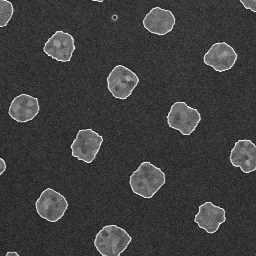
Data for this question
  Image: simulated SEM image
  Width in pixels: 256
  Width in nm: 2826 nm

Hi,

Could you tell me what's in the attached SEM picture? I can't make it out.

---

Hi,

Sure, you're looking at a regular array of raised bodies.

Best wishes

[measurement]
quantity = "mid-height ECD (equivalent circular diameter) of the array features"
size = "330 nanometres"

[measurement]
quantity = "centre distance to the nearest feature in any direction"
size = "0.785 microns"